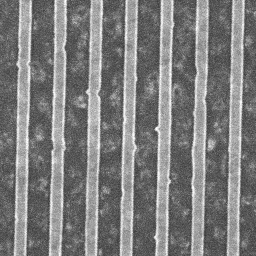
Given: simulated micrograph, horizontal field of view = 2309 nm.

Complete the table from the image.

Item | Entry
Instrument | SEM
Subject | parallel lines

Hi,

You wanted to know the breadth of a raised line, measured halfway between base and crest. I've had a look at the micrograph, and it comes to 0.0981 µm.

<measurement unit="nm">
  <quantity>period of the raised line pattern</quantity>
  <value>320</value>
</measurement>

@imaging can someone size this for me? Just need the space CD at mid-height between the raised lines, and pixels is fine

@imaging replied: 24.8